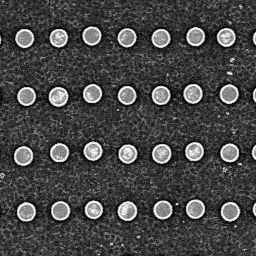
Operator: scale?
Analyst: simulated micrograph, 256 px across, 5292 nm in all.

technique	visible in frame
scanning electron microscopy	a regular array of raised bodies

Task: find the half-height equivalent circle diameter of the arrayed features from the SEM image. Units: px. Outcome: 17.7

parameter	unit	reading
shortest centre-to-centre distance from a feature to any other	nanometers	687